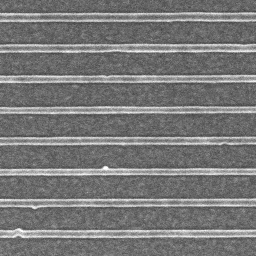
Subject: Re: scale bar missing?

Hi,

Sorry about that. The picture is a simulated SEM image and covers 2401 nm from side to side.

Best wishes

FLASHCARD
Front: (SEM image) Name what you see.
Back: parallel lines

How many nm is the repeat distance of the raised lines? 290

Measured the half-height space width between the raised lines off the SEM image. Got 220 nm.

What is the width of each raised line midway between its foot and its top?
64.5 nanometres